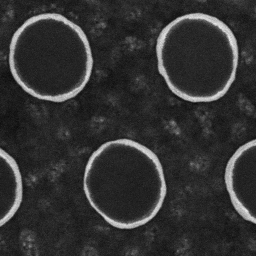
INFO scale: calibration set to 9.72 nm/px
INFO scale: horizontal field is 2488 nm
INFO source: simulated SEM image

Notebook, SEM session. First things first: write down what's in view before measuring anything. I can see raised bodies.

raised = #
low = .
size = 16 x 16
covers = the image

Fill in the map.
................
..###......###..
.####.....#####.
.#####....#####.
.#####....#####.
.####......###..
................
................
................
......###......#
#....#####....##
#....#####....##
#.....####.....#
#.....###......#
................
................